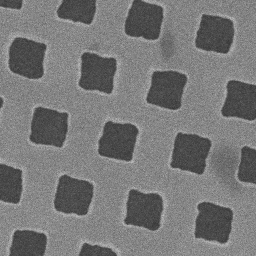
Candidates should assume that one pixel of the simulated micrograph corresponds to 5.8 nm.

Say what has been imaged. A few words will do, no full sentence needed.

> a regular array of holes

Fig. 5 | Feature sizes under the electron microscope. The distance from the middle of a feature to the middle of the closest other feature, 411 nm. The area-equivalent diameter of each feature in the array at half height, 237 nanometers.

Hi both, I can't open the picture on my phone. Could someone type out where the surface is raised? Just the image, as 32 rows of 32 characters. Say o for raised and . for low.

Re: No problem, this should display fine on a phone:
...ooooo....oooo....oooooooooooo
ooooooo.....oooo.....ooooooooooo
oooooooo....oooo....ooooo....ooo
oooooooooooooooo....ooooo....ooo
oooooooooooooooo....oooo.....ooo
o.....oooooooooooooooooo.....ooo
o.....ooooo.oooooooooooooo...ooo
o.....oooo....oooooooooooooooooo
o.....oooo.....ooooooooooooooooo
ooo..ooooo....ooooo....ooooooooo
oooooooooo....ooooo....ooooo....
oooooooooooo..oooo.....ooooo....
oooooooooooooooooo.....ooooo....
oooo..oooooooooooooo..oooooo....
oooo.....ooooooooooooooooooo....
oooo.....oooo...oooooooooooooooo
oooo....ooooo....ooooooooooooooo
oooo....oooo.....ooooo....oooooo
oooooooooooo.....ooooo....oooo..
ooooooooooooo....oooo.....oooo..
.oooooooooooooooooooo.....oooo..
...ooooooooooooooooooooo.ooooo..
...oooo....ooooooooooooooooooo..
...oooo.....oooooooooooooooooooo
...oooo.....oooo....oooooooooooo
ooooooo....ooooo.....oooo..ooooo
ooooooo....ooooo....ooooo....ooo
ooooooooooooooo.....oooo.....ooo
oooooooooooooooooo..oooo.....ooo
oo....oooooooooooooooooo.....ooo
o.....oooo.ooooooooooooooooooooo
o.....oooo.....ooooooooooooooooo